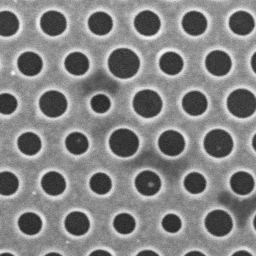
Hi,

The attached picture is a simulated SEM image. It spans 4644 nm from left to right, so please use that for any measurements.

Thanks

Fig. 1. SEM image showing a regular array of holes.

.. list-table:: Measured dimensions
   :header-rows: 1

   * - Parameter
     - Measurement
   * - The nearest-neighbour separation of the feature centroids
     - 840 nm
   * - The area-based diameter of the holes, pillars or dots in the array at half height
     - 478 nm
